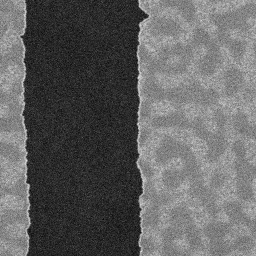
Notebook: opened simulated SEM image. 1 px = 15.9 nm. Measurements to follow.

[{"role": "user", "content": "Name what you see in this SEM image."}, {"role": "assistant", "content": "one or a few lines or trenches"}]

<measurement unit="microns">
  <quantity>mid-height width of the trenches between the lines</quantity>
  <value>1.82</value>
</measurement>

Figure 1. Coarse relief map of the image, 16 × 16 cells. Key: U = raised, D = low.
UUDDDDDDDUUUUUUU
UUDDDDDDDUUUUUUU
UDDDDDDDDUUUUUUU
UDDDDDDDDUUUUUUU
UUDDDDDDDUUUUUUU
UDDDDDDDDUUUUUUU
UDDDDDDDDUUUUUUU
UDDDDDDDDUUUUUUU
UUDDDDDDDUUUUUUU
UUDDDDDDDUUUUUUU
UUDDDDDDDUUUUUUU
UUDDDDDDDUUUUUUU
UUDDDDDDDUUUUUUU
UUDDDDDDDUUUUUUU
UUDDDDDDDUUUUUUU
UUDDDDDDDUUUUUUU